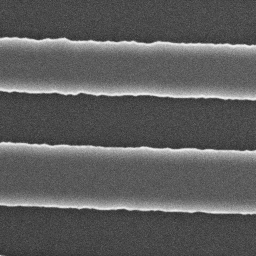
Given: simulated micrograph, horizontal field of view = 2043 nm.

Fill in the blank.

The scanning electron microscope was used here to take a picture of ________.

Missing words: lines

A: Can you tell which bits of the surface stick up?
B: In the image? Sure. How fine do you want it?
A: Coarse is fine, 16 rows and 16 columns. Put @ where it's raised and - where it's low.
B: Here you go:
----------------
----------------
@@@@------------
@@@@@@@@@@@@@@@@
@@@@@@@@@@@@@@@@
@@@@@@@@@@@@@@@@
----------------
----------------
----------------
@@@@@@@@@@@@@@@@
@@@@@@@@@@@@@@@@
@@@@@@@@@@@@@@@@
@@@@@@@@@@@@@@@@
----------------
----------------
----------------